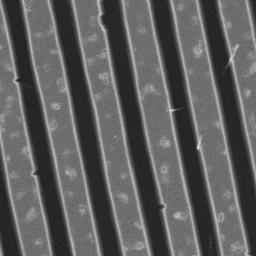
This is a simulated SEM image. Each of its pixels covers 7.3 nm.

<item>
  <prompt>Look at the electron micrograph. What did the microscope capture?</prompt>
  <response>parallel lines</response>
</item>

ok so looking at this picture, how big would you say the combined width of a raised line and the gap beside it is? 0.354 µm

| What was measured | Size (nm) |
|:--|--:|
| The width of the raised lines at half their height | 221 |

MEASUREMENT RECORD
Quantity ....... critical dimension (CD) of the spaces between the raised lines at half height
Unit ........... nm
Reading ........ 130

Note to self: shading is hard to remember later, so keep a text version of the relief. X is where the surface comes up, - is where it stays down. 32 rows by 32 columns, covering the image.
---XXXX--XXXX--XXXX--XXXX--XXXX-
X--XXXX--XXXX--XXXX--XXXX--XXXX-
X--XXXX--XXXX--XXXX---XXX---XXXX
X--XXXX--XXXX---XXX---XXXX--XXXX
X--XXXX---XXX---XXXX--XXXX--XXXX
XX-XXXXX--XXXX--XXXX--XXXX--XXXX
XX--XXXX--XXXX--XXXX--XXXX--XXXX
XX--XXXX--XXXX--XXXX---XXX---XXX
XX--XXXX--XXXX--XXXXX--XXXX--XXX
XX--XXXX---XXX---XXXX--XXXX--XXX
XX--XXXXX--XXXX--XXXX--XXXX--XXX
XXX--XXXX--XXXX--XXXX--XXXX--XXX
XXX--XXXX--XXXX--XXXX---XXXX--XX
XXX--XXXX---XXX--XXXXX--XXXX--XX
XXX--XXXX---XXX---XXXX--XXXX--XX
XXX---XXX---XXXX--XXXX--XXXX--XX
XXXX--XXXX--XXXX--XXXX--XXXX--XX
XXXX--XXXX--XXXX--XXXX---XXX---X
XXXX--XXXX--XXXX--XXXX---XXXX--X
XXXX--XXXX---XXX---XXXX--XXXX--X
XXXX---XXX---XXX---XXXX--XXXX--X
XXXX---XXXX--XXXX--XXXX--XXXX---
-XXXX--XXXX--XXXX--XXXX---XXX---
-XXXX--XXXX--XXXX--XXXX---XXXX--
-XXXX--XXXX---XXX---XXXX--XXXX--
-XXXX---XXX---XXXX--XXXX--XXXX--
-XXXXX--XXXX--XXXX--XXXX--XXXX--
--XXXX--XXXX--XXXX--XXXX---XXX--
--XXXX--XXXX--XXXX---XXX---XXXX-
--XXXX---XXX---XXXX--XXXX--XXXX-
--XXXX---XXX---XXXX--XXXX--XXXX-
---XXXX--XXXX--XXXX--XXXX--XXXX-